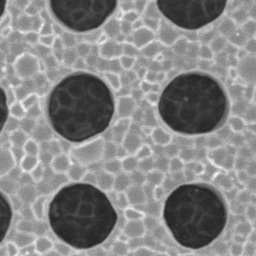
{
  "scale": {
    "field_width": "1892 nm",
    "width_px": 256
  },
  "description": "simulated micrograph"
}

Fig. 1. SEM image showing holes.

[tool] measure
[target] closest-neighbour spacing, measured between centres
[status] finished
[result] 815 nm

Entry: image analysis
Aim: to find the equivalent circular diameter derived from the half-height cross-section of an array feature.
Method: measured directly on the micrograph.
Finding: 487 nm